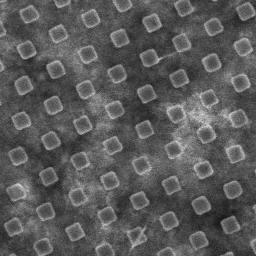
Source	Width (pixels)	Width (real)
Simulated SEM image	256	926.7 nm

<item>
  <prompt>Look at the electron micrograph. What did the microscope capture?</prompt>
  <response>a regular array of raised bodies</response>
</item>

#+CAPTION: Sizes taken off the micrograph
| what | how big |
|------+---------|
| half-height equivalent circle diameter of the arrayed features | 17.3 pixels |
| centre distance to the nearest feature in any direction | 128 nanometres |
